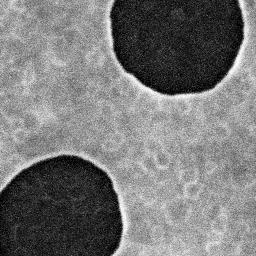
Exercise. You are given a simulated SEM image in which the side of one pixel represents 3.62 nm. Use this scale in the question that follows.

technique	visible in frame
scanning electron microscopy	holes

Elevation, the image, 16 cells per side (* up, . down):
*******........*
*******........*
*******........*
*******........*
********......**
*********....***
****************
****************
****************
****************
**....**********
.......*********
.......*********
........********
........********
.......*********